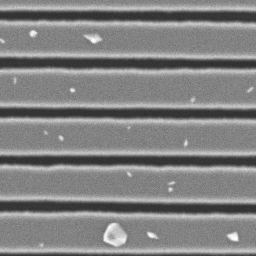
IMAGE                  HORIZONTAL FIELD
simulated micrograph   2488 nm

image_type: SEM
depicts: lines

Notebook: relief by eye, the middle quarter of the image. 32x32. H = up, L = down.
LLLLLLLLLLLLLLLLLLLLLLLLLLLLLLLL
HHHHHHHHHHHHHHHHHHHHHHHHHHHHHHHH
HHHHHHHHHHHHHHHHHHHHHHHHHHHHHHHH
HHHHHHHHHHHHHHHHHHHHHHHHHHHHHHHH
HHHHHHHHHHHHHHHHHHHHHHHHHHHHHHHH
HHHHHHHHHHHHHHHHHHHHHHHHHHHHHHHH
HHHHHHHHHHHHHHHHHHHHHHHHHHHHHHHH
HHHHHHHHHHHHHHHHHHHHHHHHHHHHHHHH
HHHHHHHHHHHHHHHHHHHHHHHHHHHHHHHH
HHHHHHHHHHHHHHHHHHHHHHHHHHHHHHHH
HHHHHHHHHHHHHHHHHHHHHHHHHHHHHHHH
LLLLLLLLLLLLLLLLLLLLLLLLLLLLLLLL
LLLLLLLLLLLLLLLLLLLLLLLLLLLLLLLL
HHHHHHHHHHHHHHLLLLHHHHHHHLLLLLLL
HHHHHHHHHHHHHHHHHHHHHHHHHHHHHHHH
HHHHHHHHHHHHHHHHHHHHHHHHHHHHHHHH
HHHHHHHHHHHHHHHHHHHHHHHHHHHHHHHH
HHHHHHHHHHHHHHHHHHHHHHHHHHHHHHHH
HHHHHHHHHHHHHHHHHHHHHHHHHHHHHHHH
HHHHHHHHHHHHHHHHHHHHHHHHHHHHHHHH
HHHHHHHHHHHHHHHHHHHHHHHHHHHHHHHH
HHHHHHHHHHHHHHHHHHHHHHHHHHHHHHHH
HHHHHHHHHHHHHHHHHHHHHHHHHHHHHHHH
LLLLLLLLLLLLLLLLLLLLLLLLLLLLLLLL
LLLLLLLLLLLLLLLLLLLLLLLLLLLLLLLL
HHHHHHHHHHHHHHHHHHHHHHHLHHHHHHHH
HHHHHHHHHHHHHHHHHHHHHHHHHHHHHHHH
HHHHHHHHHHHHHHHHHHHHHHHHHHHHHHHH
HHHHHHHHHHHHHHHHHHHHHHHHHHHHHHHH
HHHHHHHHHHHHHHHHHHHHHHHHHHHHHHHH
HHHHHHHHHHHHHHHHHHHHHHHHHHHHHHHH
HHHHHHHHHHHHHHHHHHHHHHHHHHHHHHHH